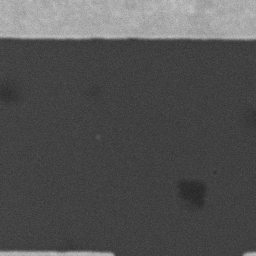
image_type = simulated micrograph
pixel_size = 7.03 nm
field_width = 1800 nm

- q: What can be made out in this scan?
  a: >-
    wiring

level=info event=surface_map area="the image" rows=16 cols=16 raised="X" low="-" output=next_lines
XXXXXXXXXXXXXXXX
XXXXXXXXXXXXXXXX
----------------
----------------
----------------
----------------
----------------
----------------
----------------
----------------
----------------
----------------
----------------
----------------
----------------
----------------